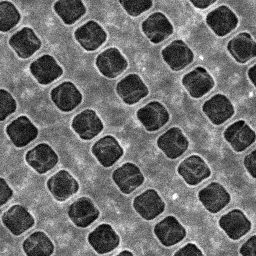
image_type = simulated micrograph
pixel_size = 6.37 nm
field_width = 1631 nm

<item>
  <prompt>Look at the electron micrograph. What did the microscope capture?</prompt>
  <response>a regular array of holes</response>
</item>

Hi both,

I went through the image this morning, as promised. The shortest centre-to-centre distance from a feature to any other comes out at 214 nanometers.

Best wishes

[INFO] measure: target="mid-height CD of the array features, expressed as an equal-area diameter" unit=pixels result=29.8